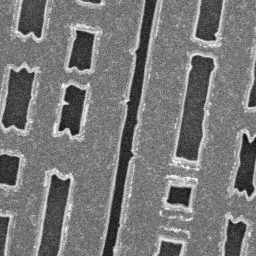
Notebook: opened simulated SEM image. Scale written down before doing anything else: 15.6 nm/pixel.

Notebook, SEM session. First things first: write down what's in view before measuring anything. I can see parallel lines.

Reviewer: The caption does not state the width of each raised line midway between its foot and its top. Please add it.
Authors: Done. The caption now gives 669 nanometres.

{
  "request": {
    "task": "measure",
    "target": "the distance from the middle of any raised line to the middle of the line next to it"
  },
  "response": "59.6 px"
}